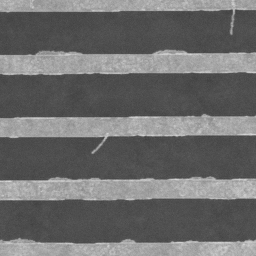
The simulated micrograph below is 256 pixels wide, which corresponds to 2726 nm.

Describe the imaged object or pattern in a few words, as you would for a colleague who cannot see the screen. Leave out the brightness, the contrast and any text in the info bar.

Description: lines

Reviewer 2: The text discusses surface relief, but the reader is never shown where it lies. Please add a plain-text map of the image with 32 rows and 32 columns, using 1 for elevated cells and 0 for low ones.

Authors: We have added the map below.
11111111111111111111111111111111
00000000000000000000000000000000
00000000000000000000000000000000
00000000000000000000000000000000
00000000000000000000000000000000
00000000000000000000000000000000
00000000000000000000000000000000
11111111111111111111111111111111
11111111111111111111111111111111
00000000000000000000000000000000
00000000000000000000000000000000
00000000000000000000000000000000
00000000000000000000000000000000
00000000000000000000000000000000
00000000000000000000000000000000
11111111111111111111111111111111
11111111111111111111111111111111
00000000000000000000000000000000
00000000000000000000000000000000
00000000000000000000000000000000
00000000000000000000000000000000
00000000000000000000000000000000
00000000000000000000011100000111
11111111111111111111111111111111
11111111111111111111111111111111
00000000000000000000000000000000
00000000000000000000000000000000
00000000000000000000000000000000
00000000000000000000000000000000
00000000000000000000000000000000
11001111110011111111111111111111
11111111111111111111111111111111